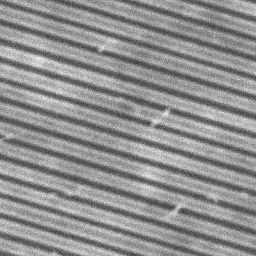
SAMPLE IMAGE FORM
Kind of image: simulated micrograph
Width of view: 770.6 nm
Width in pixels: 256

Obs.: parallel lines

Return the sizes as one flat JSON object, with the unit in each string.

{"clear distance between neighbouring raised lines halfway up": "23.8 nm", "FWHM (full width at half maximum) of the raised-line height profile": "32.4 nanometers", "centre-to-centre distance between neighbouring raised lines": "55.8 nanometers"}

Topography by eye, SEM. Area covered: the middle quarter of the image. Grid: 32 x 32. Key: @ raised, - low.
@--------@@@@@@@@@-------@@@@@@@
@@@@@-------@@@@@@@@@-------@@@@
@@@@@@@@--------@@@@@@@@-------@
---@@@@@@@@--------@@@@@@@@@----
------@@@@@@@@@-------@@@@@@@@@-
@@-------@@@@@@@@@--------@@@@@@
@@@@@@-------@@@@@@@@--------@@@
@@@@@@@@@-------@@@@@@@@@-------
---@@@@@@@@@@-------@@@@@@@@----
------@@@@@@@@@@@------@@@@@@@@-
@@@-------@@@@@@@@@-------@@@@@@
@@@@@@-------@@@@@@@@@@-------@@
@@@@@@@@@@-------@@@@@@@@@------
----@@@@@@@@@-------@@@@@@@@@---
-------@@@@@@@@@------@@@@@@@@@@
@@@-------@@@@@@@@@@-------@@@@@
@@@@@@@-------@@@@@@@@@-------@@
-@@@@@@@@@-------@@@@@@@@@------
-----@@@@@@@@-------@@@@@@@@@@--
--------@@@@@@@@@-------@@@@@@@@
@@@@--------@@@@@@@@-------@@@@@
@@@@@@@--------@@@@@@@@-------@@
-@@@@@@@@@--------@@@@@@@@@-----
----@@@@@@@@@@--------@@@@@@@@--
@-------@@@@@@@@@--------@@@@@@@
@@@@-------@@@@@@@@@--------@@@@
@@@@@@@-------@@@@@@@@@@--------
--@@@@@@@@@-------@@@@@@@@@-----
------@@@@@@@@-------@@@@@@@@@@-
@@-------@@@@@@@@-------@@@@@@@@
@@@@@-------@@@@@@@@@-------@@@@
@@@@@@@@@-------@@@@@@@@-------@